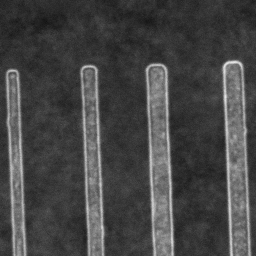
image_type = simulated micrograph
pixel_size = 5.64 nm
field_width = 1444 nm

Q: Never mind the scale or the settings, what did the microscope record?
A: one or a few lines or trenches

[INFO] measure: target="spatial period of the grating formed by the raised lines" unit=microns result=0.409